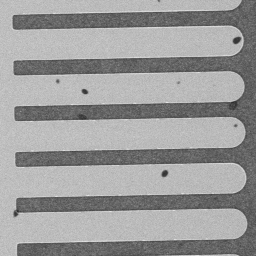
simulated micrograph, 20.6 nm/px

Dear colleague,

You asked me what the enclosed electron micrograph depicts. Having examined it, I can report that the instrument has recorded groups of lines, slits or small figures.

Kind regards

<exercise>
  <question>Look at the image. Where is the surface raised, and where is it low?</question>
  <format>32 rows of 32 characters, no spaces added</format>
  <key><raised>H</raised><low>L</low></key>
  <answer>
HHHHHHHHHHHHHHHHHHHHHHHHHHHHHHLL
HHHHHHHHHHHHLLLLLLLLLLLLLLLLLLLL
HHLLLLLLLLLLLLLLLLLLLLLLLLLLLLLL
HHLLLLLLLLLLLLLLLLLLLHHHHHHHHLLL
HHHHHHHHHHHHHHHHHHHHHHHHHHHHHHLL
HHHHHHHHHHHHHHHHHHHHHHHHHHHHHHLL
HHHHHHHHHHHHHHHHHHHHHHHHHHHHHHLL
HHLLLLLLLLLLLLLLLLLLLLLLLLLLLLLL
HHLLLLLLLLLLLLLLLLLLLLLLLLLLLLLL
HHHHHHHHHHHHHHHHHHHHHHHHHHHHHHLL
HHHHHHHHHHHHHHHHHHHHHHHHHHHHHHLL
HHHHHHHHHHHHHHHHHHHHHHHHHHHHHHLL
HHHHHHHHHHHHHHHHHHHHHHHHHHHHHLLL
HHLLLLLLLLLLLLLLLLLLLLLLLLLLLLLL
HHLLLLLLLLLLLLLLLLLLLLLLLLLLLLLL
HHHHHHHHHHHHHHHHHHHHHHHHHHHHHHLL
HHHHHHHHHHHHHHHHHHHHHHHHHHHHHHHL
HHHHHHHHHHHHHHHHHHHHHHHHHHHHHHLL
HHHHHHHHHHHHHHHHHHHHHHLLLLLLLLLL
HHLLLLLLLLLLLLLLLLLLLLLLLLLLLLLL
HHLLLLLLLLLLLLLLLLLLLLLLLHHHHLLL
HHHHHHHHHHHHHHHHHHHHHHHHHHHHHHHL
HHHHHHHHHHHHHHHHHHHHHHHHHHHHHHHL
HHHHHHHHHHHHHHHHHHHHHHHHHHHHHHLL
HHHHHHHHHHLLLLLLLLLLLLLLLLLLLLLL
HHLLLLLLLLLLLLLLLLLLLLLLLLLLLLLL
HHLLLLLLLLLHHHHHHHHHHHHHHHHHHHLL
HHHHHHHHHHHHHHHHHHHHHHHHHHHHHHHL
HHHHHHHHHHHHHHHHHHHHHHHHHHHHHHHL
HHHHHHHHHHHHHHHHHHHHHHHHHHHHHHLL
HHLLLLLLLLLLLLLLLLLLLLLLLLLLLLLL
HHLLLLLLLLLLLLLLLLLLLLLLLLLLLLLL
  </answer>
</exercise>